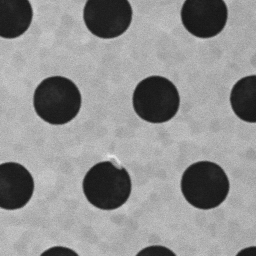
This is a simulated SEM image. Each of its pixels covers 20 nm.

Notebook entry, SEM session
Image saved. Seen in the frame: holes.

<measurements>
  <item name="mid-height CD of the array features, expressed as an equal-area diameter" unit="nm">973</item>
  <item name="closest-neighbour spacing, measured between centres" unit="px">98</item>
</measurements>